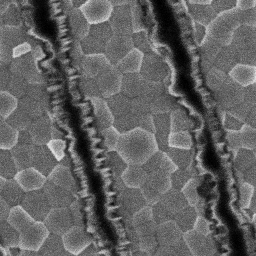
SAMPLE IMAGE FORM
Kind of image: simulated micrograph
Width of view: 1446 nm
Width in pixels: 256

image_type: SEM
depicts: one or a few lines or trenches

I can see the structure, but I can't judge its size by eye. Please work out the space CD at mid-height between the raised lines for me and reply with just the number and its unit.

0.545 micrometres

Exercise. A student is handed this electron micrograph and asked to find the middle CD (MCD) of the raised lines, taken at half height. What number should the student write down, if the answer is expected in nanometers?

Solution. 138